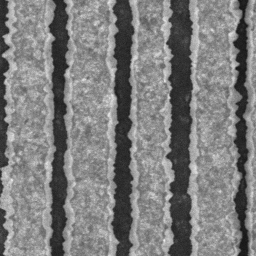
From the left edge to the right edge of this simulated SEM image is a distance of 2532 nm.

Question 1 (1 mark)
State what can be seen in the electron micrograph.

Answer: one or a few lines or trenches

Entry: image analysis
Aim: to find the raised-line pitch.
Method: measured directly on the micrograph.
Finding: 612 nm